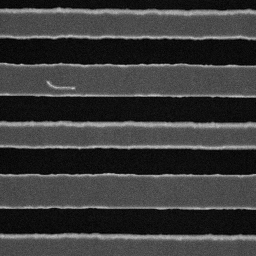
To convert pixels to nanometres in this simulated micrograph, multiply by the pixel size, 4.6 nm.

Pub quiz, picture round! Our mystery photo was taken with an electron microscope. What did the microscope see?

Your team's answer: lines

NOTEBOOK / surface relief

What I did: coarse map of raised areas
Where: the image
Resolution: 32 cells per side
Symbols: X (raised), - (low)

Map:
--------------------------------
XXXXXXXXXXXXXXXXXXXXXXXXXXXXXXXX
XXXXXXXXXXXXXXXXXXXXXXXXXXXXXXXX
XXXXXXXXXXXXXXXXXXXXXXXXXXXXXXXX
XXXXXXXXXXXXXXXXXXXXXXXXXXXXXXXX
--------------------------------
--------------------------------
--------------------------------
XXXXXXXXXXXXXXXXXXXXXXXXXXXXXXXX
XXXXXXXXXXXXXXXXXXXXXXXXXXXXXXXX
XXXXXXXXXXXXXXXXXXXXXXXXXXXXXXXX
XXXXXXXXXXXXXXXXXXXXXXXXXXXXXXXX
--------------------------------
--------------------------------
--------------------------------
XXXXXXXXXXXXXXXXXXXXXXXXXXXXXXXX
XXXXXXXXXXXXXXXXXXXXXXXXXXXXXXXX
XXXXXXXXXXXXXXXXXXXXXXXXXXXXXXXX
--XXXX-XXXXX--XXXXXXXXXXXXXXXXXX
--------------------------------
--------------------------------
--------------------------------
XXXXXXXXXXXXXXXXXXXXXXXXXXXXXXXX
XXXXXXXXXXXXXXXXXXXXXXXXXXXXXXXX
XXXXXXXXXXXXXXXXXXXXXXXXXXXXXXXX
XXXXXXXXXXXXXXXXXXXXXXXXXXXXXXXX
--------------------------------
--------------------------------
--------------------------------
XXXXXXXXXXXXXXXXXXXXXXXXXXXXXXXX
XXXXXXXXXXXXXXXXXXXXXXXXXXXXXXXX
XXXXXXXXXXXXXXXXXXXXXXXXXXXXXXXX